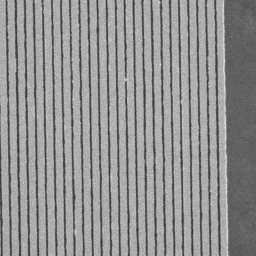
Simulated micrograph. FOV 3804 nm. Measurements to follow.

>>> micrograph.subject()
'parallel lines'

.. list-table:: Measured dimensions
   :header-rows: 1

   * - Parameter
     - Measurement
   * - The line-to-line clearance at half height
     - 2.62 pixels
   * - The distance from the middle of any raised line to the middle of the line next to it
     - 135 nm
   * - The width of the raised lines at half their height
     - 94.7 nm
